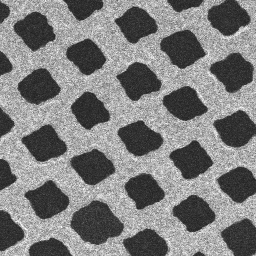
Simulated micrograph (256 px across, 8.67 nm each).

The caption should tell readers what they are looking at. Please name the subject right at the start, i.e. a regular array of holes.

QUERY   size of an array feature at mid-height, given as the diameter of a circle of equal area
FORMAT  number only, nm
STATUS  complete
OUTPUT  315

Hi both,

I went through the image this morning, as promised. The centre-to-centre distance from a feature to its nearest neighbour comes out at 463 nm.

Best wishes